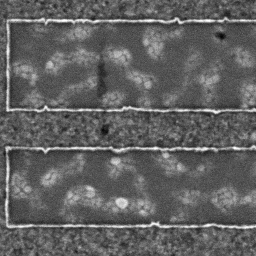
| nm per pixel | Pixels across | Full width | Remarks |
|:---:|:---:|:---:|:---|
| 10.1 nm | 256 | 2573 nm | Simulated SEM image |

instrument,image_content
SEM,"one or a few lines or trenches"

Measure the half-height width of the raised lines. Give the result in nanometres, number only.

388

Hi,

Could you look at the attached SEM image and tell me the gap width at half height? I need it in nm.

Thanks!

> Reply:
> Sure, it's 839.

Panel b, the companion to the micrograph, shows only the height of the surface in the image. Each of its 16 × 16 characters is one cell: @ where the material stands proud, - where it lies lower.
@@@@@@@@@@@@@@@@
@---------------
----------------
----------------
----------------
----------------
@---------------
@@@@@@@@@@@@@@@@
@@@@@@@@@@@@@@@@
@---------------
----------------
----------------
----------------
----------------
@@@@@@@@@@@@@@@@
@@@@@@@@@@@@@@@@